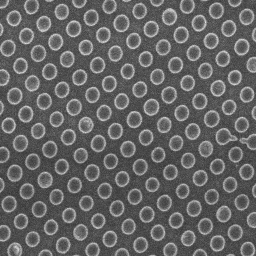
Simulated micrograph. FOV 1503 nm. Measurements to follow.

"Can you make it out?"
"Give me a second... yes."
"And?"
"a regular array of raised bodies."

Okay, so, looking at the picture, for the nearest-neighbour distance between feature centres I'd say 124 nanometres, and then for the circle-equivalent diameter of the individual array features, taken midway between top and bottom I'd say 0.0864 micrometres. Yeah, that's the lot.